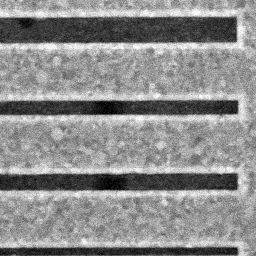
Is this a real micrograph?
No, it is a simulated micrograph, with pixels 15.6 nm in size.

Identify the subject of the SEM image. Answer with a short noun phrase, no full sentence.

one or a few lines or trenches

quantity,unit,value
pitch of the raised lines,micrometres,1.15